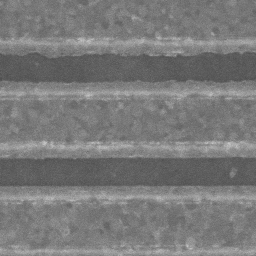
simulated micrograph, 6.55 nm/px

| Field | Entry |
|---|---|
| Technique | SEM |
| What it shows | one or a few lines or trenches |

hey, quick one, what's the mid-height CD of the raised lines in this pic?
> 0.356 microns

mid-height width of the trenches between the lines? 327 nanometres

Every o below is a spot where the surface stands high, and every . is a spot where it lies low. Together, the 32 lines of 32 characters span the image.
oooooooooooooooooooooooooooooooo
oooooooooooooooooooooooooooooooo
oooooooooooooooooooooooooooooooo
oooooooooooooooooooooooooooooooo
oooooooooooooooooooooooooooooooo
......................o.........
................................
................................
................................
................................
................................
................................
oooooooooooooooooooooooooooooooo
oooooooooooooooooooooooooooooooo
oooooooooooooooooooooooooooooooo
oooooooooooooooooooooooooooooooo
oooooooooooooooooooooooooooooooo
oooooooooooooooooooooooooooooooo
o.....................o.........
................................
................................
................................
................................
................................
................................
oooooooooooooooooooooooooooooooo
oooooooooooooooooooooooooooooooo
oooooooooooooooooooooooooooooooo
oooooooooooooooooooooooooooooooo
oooooooooooooooooooooooooooooooo
oooooooooooooooooooooooooooooooo
..............oo.ooooooo........